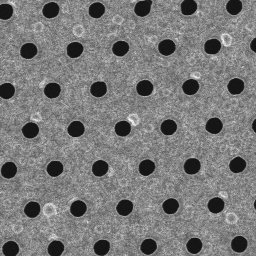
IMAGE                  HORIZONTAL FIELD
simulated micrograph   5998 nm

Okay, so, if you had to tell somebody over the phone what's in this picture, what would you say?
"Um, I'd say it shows a regular array of holes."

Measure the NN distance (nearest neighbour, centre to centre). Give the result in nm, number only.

1060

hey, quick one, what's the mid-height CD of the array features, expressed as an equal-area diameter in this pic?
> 392 nm